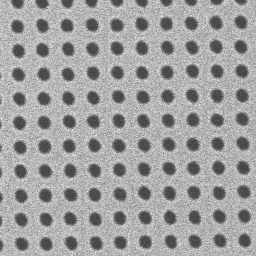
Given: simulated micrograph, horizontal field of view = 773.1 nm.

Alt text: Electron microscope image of a regular array of holes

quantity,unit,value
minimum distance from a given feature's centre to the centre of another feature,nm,72.2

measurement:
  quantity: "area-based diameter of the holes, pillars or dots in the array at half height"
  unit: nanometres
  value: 37.9